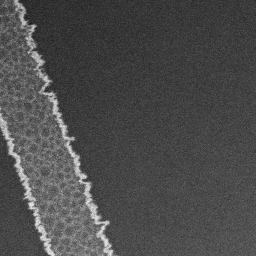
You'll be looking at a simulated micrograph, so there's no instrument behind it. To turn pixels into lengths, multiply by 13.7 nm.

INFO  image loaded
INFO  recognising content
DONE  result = one or a few lines or trenches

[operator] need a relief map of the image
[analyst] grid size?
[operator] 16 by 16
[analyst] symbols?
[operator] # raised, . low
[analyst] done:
#...............
##..............
##..............
##..............
###.............
###.............
###.............
####............
####............
.####...........
.####...........
..###...........
..####..........
..####..........
...###..........
...####.........